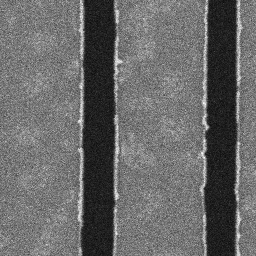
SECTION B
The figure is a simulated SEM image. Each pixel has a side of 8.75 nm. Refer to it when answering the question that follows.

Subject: one or a few lines or trenches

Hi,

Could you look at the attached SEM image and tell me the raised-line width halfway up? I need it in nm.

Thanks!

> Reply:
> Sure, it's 324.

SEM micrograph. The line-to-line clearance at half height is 761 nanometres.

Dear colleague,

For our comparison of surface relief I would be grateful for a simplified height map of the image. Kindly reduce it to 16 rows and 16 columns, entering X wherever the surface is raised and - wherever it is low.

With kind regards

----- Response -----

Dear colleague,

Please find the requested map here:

-----XX------XX-
-----XX------XX-
-----XX------XX-
-----XX------XX-
-----XX------XX-
-----XX------XX-
-----XX------XX-
-----XX------XX-
-----XX------XX-
-----XX------XX-
-----XX------XX-
-----XX------XX-
-----XX------XX-
-----XX------XX-
-----XX------XX-
-----XX------XX-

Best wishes